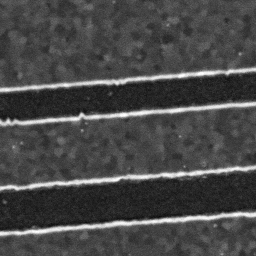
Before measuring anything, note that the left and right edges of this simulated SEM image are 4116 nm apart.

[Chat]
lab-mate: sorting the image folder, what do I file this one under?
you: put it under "one or a few lines or trenches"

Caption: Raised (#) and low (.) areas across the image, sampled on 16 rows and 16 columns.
################
################
################
################
##############..
##..............
................
...#############
################
################
################
###.............
................
..............##
..##############
################